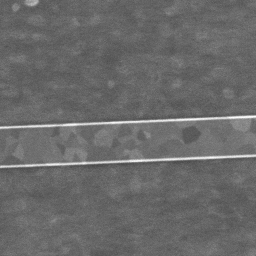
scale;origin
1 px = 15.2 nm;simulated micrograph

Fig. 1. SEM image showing one or a few lines or trenches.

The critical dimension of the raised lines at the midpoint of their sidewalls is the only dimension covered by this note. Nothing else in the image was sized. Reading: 602 nm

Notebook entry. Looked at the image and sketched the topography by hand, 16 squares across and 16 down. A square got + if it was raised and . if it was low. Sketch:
................
................
................
................
................
................
................
...........+++++
++++++++++++++++
++++++++++++++++
................
................
................
................
................
................